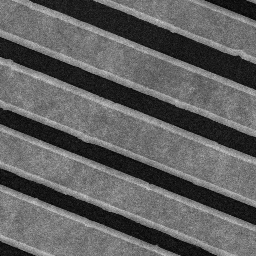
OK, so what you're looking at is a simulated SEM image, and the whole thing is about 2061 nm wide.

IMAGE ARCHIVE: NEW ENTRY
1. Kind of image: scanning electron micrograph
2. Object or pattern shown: one or a few lines or trenches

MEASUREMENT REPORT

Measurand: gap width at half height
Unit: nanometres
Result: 179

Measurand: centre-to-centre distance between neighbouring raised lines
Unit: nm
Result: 503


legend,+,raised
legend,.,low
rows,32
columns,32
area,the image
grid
++++..........++++++++++++......
+++++++.........++++++++++++....
+++++++++..........++++++++++++.
++++++++++++.........+++++++++++
.+++++++++++++..........++++++++
...+++++++++++++..........++++++
......+++++++++++++..........+++
........+++++++++++++...........
+++........+++++++++++++........
+++++........++++++++++++++.....
++++++++........+++++++++++++...
++++++++++........++++++++++++++
+++++++++++++........+++++++++++
.++++++++++++++.........++++++++
....++++++++++++++........++++++
.......+++++++++++++.........+++
+........++++++++++++++........+
++++.......++++++++++++++.......
+++++++.......++++++++++++++....
+++++++++........+++++++++++++..
++++++++++++.......+++++++++++++
..++++++++++++........++++++++++
.....++++++++++++.......++++++++
.......++++++++++++........+++++
+++.......++++++++++++.......+++
+++++.......++++++++++++........
++++++++.......++++++++++++.....
++++++++++........+++++++++++...
+++++++++++++.......++++++++++++
+++++++++++++++.......++++++++++
..++++++++++++++++.......+++++++
....++++++++++++++++.......+++++